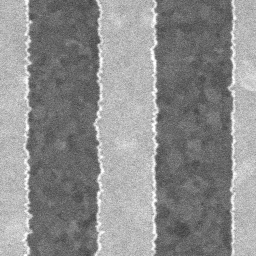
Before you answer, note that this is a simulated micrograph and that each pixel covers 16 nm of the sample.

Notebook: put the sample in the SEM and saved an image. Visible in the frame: one or a few lines or trenches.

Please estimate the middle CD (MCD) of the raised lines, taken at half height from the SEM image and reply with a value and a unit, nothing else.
1.22 microns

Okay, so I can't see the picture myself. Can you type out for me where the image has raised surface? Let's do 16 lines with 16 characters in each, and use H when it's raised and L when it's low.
LLHHHHLLLLHHHHHL
LLHHHHLLLLHHHHHL
LLHHHHLLLLHHHHHL
LLHHHHLLLLHHHHHL
LLHHHHLLLLHHHHHL
LLHHHHLLLLHHHHHL
LLHHHHLLLLHHHHHL
LLHHHHLLLLHHHHHL
LLHHHHLLLLHHHHHL
LLHHHHLLLLHHHHHL
LLHHHHLLLLHHHHHL
LLHHHHLLLLHHHHHL
LLHHHHLLLLHHHHHL
LLHHHHLLLLHHHHHL
LLHHHHLLLLHHHHHL
LLHHHHLLLLHHHHHL